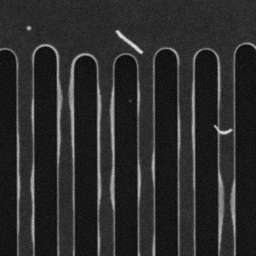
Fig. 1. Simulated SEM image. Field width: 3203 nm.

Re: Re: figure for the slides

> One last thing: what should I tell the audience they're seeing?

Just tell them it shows groups of lines, slits or small figures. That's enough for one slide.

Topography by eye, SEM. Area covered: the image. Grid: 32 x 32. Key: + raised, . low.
++++++++++++++++++++++++++++++++
++++++++++++++++++++++++++++++++
++++++++++++++++++++++++++++++++
++++++++++++++++++++++++++++++++
++++++++++++++++++++++++++++++++
++++++++++++++++++++++++++++++++
.+++...+++++++++++++..+++..++...
..++...++...+++..++...++...++...
..++...++...++...++...++...++...
..++...++...++...++...++...++...
..++...++...++...++...++...++...
..++...++...++...++...++...++...
..++...++...++...++...++...++...
..++...++...++...++...++...++...
..++...++...++...++...++...++...
..++...++...++...++...++...++...
..++...++...++...++...++...++...
..++...++...++...++...++...++...
..++...++...++...++...++...++...
..++...++...++...++...++...++...
..++...++...++...++...++...++...
..++...++...++...++...++...++...
..++...++...++...++...++...++...
..++...++...++...++...++....+...
..++...++...++...++...++....+...
..++...++...++...++...++....+...
..++...++...++...++...++....+...
..++...++...++...++...++....+...
..++...++...++...++...++....+...
..++...++...++...++...++...++...
..++...++...++...++...++...++...
..++...++...++...++...++...++...